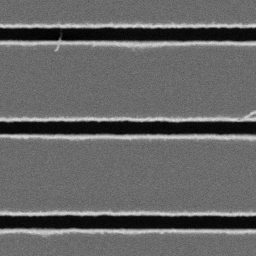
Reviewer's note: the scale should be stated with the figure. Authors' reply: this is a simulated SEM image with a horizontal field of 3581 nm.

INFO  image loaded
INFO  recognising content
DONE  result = lines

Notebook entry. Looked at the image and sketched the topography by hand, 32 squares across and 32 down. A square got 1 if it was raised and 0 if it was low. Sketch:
11111111111111111111111111111111
11111111111111111111111111111111
11111111111111111111111111111111
00000000000000000000000000000000
00000000000000000000000000000000
11111111111111111111111111111111
11111111111111111111111111111111
11111111111111111111111111111111
11111111111111111111111111111111
11111111111111111111111111111111
11111111111111111111111111111111
11111111111111111111111111111111
11111111111111111111111111111111
11111111111111111111111111111111
11111111111111111111111111111111
00000000000000000000000000000000
00000000000000000000000000000000
11111111111111111111111111111111
11111111111111111111111111111111
11111111111111111111111111111111
11111111111111111111111111111111
11111111111111111111111111111111
11111111111111111111111111111111
11111111111111111111111111111111
11111111111111111111111111111111
11111111111111111111111111111111
11111111111111111111111111111111
00000000000000000000000000000000
00000000000000000000000000000000
11111111111111111111111111111111
11111111111111111111111111111111
11111111111111111111111111111111